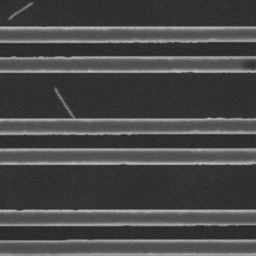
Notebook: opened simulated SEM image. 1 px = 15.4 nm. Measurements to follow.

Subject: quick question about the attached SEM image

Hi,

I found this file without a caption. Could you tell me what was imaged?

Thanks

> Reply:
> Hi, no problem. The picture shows lines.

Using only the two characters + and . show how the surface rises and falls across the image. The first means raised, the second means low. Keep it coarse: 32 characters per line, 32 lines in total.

................................
................................
................................
++++++++++++++++++++++++++++++++
++++++++++++++++++++++++++++++++
................................
................................
++++++++++++++++++++++++++++++++
++++++++++++++++++++++++++++++++
................................
................................
................................
................................
................................
................................
++++++++++++++++++++++++++++++++
++++++++++++++++++++++++++++++++
................................
................................
++++++++++++++++++++++++++++++++
++++++++++++++++++++++++++++++++
................................
................................
................................
................................
................................
++++++++++++++++++++++++++++++++
++++++++++++++++++++++++++++++++
................................
................................
++++++++++++++++++++++++++++++++
++++++++++++++++++++++++++++++++